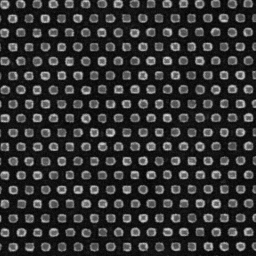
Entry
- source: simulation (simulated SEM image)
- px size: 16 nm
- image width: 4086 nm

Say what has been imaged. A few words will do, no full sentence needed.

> a regular array of raised bodies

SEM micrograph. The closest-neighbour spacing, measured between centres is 253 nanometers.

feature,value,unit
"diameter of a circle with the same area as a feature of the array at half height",137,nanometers